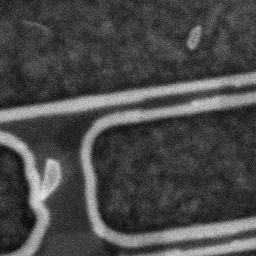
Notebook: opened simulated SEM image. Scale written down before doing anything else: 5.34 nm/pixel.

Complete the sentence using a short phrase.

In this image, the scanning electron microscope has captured one or a few lines or trenches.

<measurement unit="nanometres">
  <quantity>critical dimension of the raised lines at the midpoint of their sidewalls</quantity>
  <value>117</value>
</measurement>